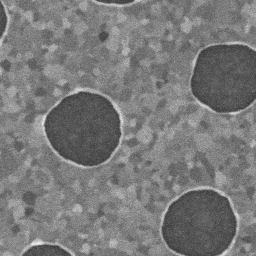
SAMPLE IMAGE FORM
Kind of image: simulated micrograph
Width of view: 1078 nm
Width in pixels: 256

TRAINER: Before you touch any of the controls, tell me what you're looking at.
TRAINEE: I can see holes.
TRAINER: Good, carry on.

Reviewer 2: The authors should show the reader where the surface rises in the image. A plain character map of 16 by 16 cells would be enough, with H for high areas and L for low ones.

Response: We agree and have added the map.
HHHHHHHHHHHHHHHH
HHHHHHHHHHHHHHHH
HHHHHHHHHHHHHHHH
HHHHHHHHHHHHLLLL
HHHHHHHHHHHHLLLL
HHHHHHHHHHHHLLLL
HHHHLLLHHHHHHLLL
HHHLLLLLHHHHHHHH
HHHLLLLLHHHHHHHH
HHHHLLLHHHHHHHHH
HHHHHHHHHHHHHHHH
HHHHHHHHHHHHHHHH
HHHHHHHHHHHLLLHH
HHHHHHHHHHLLLLLH
HHHHHHHHHHLLLLLH
HHLLHHHHHHHLLLHH